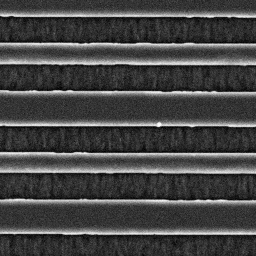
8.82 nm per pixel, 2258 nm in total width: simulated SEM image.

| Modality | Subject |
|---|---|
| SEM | lines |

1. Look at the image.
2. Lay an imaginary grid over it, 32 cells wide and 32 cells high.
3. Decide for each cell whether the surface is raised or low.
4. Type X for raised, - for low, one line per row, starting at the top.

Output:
XXXXXXXXXXXXXXXXXXXXXXXXXXXXXXXX
XXXXXXXXXXXXXXXXXXXXXXXXXXXXXXXX
--------------------------------
--------------------------------
--------------------------------
XXXXXXXXX--XXX---XX----XX-------
XXXXXXXXXXXXXXXXXXXXXXXXXXXXXXXX
XXXXXXXXXXXXXXXXXXXXXXXXXXXXXXXX
--------------------------------
--------------------------------
--------------------------------
XXXXXXXXXXXXXXXXXXXX-XXXX-X-----
XXXXXXXXXXXXXXXXXXXXXXXXXXXXXXXX
XXXXXXXXXXXXXXXXXXXXXXXXXXXXXXXX
XXXXXXXXXXXXXXXXXXXXXXXXXXXXXXXX
XXXXXXXXXXXXXXXXXXXXXXXXXXXXXXXX
--------------------------------
--------------------------------
--------------------------------
XXXXXXXXXXXXXXXXXXXXXXXXXXXXXXXX
XXXXXXXXXXXXXXXXXXXXXXXXXXXXXXXX
-----------X-X----XXX---XXXXXXXX
--------------------------------
--------------------------------
--------------------------------
XXXXXXXXXXXXXXXXXXXXXXXXXXXXXXXX
XXXXXXXXXXXXXXXXXXXXXXXXXXXXXXXX
XXXXXXXXXXXXXXXXXXXXXXXXXXXXXXXX
XXXXXXXXXXXXXXXXXXXXXXXXXXXXXXXX
--------------------------------
--------------------------------
--------------------------------